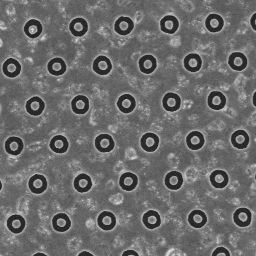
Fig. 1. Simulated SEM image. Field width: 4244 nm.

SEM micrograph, a regular array of ring-shaped grooves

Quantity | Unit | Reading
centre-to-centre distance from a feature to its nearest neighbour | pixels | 44.7